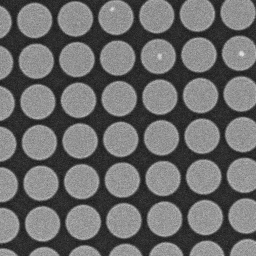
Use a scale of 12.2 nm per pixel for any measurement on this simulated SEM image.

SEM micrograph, an array of small figures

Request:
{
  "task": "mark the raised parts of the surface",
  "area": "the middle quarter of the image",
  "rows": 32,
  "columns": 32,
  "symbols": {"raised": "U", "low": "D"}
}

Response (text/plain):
UUUUUUUDDDUUUUUUUDDDUUUUUUUDDDDU
UUUUUUUDDDUUUUUUDDDDDUUUUUDDDDDD
DUUUUUDDDDDDUUUDDDDDDDDDDDDDDDDD
DDDDDDDDDDDDDDDDDDDDDDDDDDDDDDDD
DDDDDDDDDDDDDUUDDDDDDDUUUUDDDDDU
DUUUUUDDDDDUUUUUUDDDDUUUUUUDDDUU
UUUUUUUDDDUUUUUUUUDDUUUUUUUUDDUU
UUUUUUUUDDUUUUUUUUDDUUUUUUUUDDUU
UUUUUUUUDDUUUUUUUUDDUUUUUUUUDDUU
UUUUUUUUDDUUUUUUUUDDUUUUUUUUDDUU
UUUUUUUUDDUUUUUUUUDDUUUUUUUUDDDU
UUUUUUUDDDDUUUUUUDDDDUUUUUUDDDDD
DUUUUUDDDDDDUUUUDDDDDDDUUDDDDDDD
DDDDDDDDDDDDDDDDDDDDDDDDDDDDDDDD
DDDDDDDDDDDDDDDDDDDDDDDUUUDDDDDD
DDUUUUDDDDDUUUUUUDDDDUUUUUUDDDDU
DUUUUUUDDDDUUUUUUUDDDUUUUUUUDDDU
UUUUUUUUDDUUUUUUUUDDUUUUUUUUDDUU
UUUUUUUUDDUUUUUUUUUDUUUUUUUUUDUU
UUUUUUUUDDUUUUUUUUDDUUUUUUUUUDDU
UUUUUUUUDDUUUUUUUUDDDUUUUUUUDDDU
UUUUUUUUDDDUUUUUUUDDDUUUUUUDDDDD
DUUUUUUDDDDDUUUUDDDDDDDUUUDDDDDD
DDDDUDDDDDDDDDDDDDDDDDDDDDDDDDDD
DDDDDDDDDDDDDDDDDDDDDDDDUUDDDDDD
DDDUUUDDDDDDUUUUUDDDDDUUUUUUDDDD
DUUUUUUUDDDUUUUUUUDDDUUUUUUUDDDU
DUUUUUUUDDDUUUUUUUUDDUUUUUUUUDDU
UUUUUUUUUDUUUUUUUUUDDUUUUUUUUDDU
UUUUUUUUUDUUUUUUUUUDDUUUUUUUUDDU
UUUUUUUUDDDUUUUUUUUDDUUUUUUUUDDU
DUUUUUUUDDDUUUUUUUDDDDUUUUUUDDDD